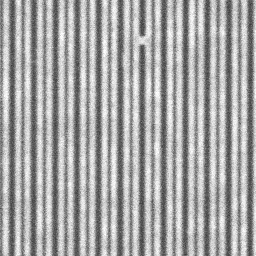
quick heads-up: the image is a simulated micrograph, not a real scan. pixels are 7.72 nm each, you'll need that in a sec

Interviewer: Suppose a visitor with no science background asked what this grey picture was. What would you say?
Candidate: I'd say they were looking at parallel lines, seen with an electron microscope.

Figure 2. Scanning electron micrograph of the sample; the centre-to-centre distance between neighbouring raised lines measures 10.8 pixels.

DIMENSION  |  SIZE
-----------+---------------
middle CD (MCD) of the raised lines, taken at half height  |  0.0434 micrometres